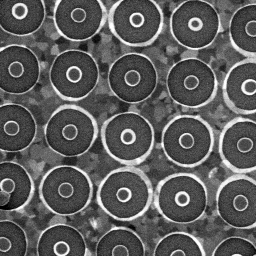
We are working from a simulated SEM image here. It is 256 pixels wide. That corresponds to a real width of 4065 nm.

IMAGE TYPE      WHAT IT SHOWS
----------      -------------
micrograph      an array of small figures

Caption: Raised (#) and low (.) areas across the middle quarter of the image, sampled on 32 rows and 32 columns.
........####..........######....
.###....####...........####.....
.###.....##.....###....###......
.###....###....####....###....##
........###.....###....###....##
........####...........###....##
.......#####..........####......
......#######.........#####.....
.....#########.......######.....
################..##########....
###############################.
.....###########################
......########....##############
.......#####........########....
.......####..........######.....
.##.....##............####......
###.....##............###.......
###.....##.....##.....###.....#.
.##.....##.....##.....###....###
.......###.....##.....###....###
.......###............###....###
......#####..........####.......
....########.........#####......
#############.......#######.....
###############...##########....
.###############################
....##########....##############
.....#######.......#############
......#####.........######......
......####...........####.......
##.....##............###........
##.....##.....##......#.........